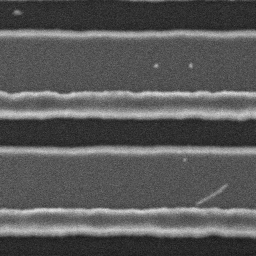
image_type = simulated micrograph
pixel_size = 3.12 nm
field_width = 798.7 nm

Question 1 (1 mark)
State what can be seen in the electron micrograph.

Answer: lines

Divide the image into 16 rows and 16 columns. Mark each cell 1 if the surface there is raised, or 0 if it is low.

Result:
0000000000000000
0000000000000000
1111111111111111
1111111111111111
1111111111111111
1111111111111111
1111111111111111
0000000000000000
0000000000000000
1111111111111111
1111111111111111
1111111111111111
1111111111111111
1111111111111111
1111011001111111
0000000000000000